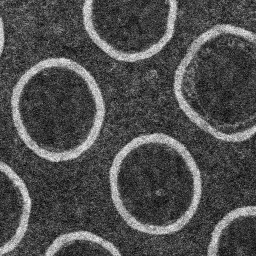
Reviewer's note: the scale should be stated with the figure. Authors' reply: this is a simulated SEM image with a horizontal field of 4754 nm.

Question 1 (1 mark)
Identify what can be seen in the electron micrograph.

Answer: raised bodies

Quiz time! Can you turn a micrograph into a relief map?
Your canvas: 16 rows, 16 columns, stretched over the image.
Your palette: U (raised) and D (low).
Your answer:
DDDDDUUUUUUDDDDD
DDDDDDUUUUUDDDDD
DDDDDDUUUUDDDUUU
DDDDDDDDUDDDUUUU
DDUUUDDDDDDUUUUU
DUUUUUDDDDDUUUUU
DUUUUUDDDDDUUUUU
DUUUUUDDDDDDUUUU
DDUUUUDDDDDDDDUD
DDDUUDDDUUUDDDDD
DDDDDDDUUUUUDDDD
UDDDDDDUUUUUDDDD
UUDDDDDUUUUUDDDD
UUDDDDDDUUUUDDDU
UDDDDDDDDDDDDDUU
DDDUUUUDDDDDDUUU